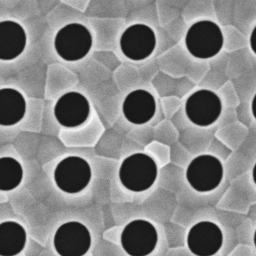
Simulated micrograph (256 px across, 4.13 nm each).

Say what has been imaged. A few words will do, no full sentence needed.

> a regular array of holes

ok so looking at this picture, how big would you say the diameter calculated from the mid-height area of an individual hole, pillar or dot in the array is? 149 nm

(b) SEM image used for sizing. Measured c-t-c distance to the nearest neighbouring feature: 0.269 µm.